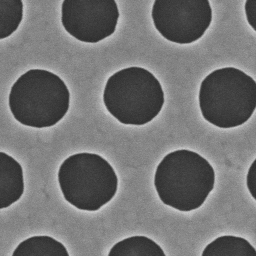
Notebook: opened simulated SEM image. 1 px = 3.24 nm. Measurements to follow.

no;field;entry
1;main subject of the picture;holes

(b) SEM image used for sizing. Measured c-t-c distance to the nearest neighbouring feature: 308 nanometers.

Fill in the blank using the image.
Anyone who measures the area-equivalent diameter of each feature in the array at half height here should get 193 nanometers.